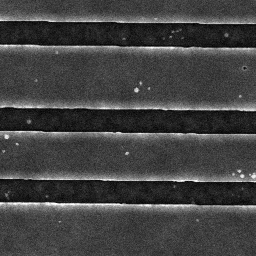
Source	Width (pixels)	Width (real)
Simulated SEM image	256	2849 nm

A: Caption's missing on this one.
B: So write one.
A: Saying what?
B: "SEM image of lines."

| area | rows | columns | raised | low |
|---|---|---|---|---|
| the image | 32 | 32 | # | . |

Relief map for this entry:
################################
################################
################################
................................
................................
................................
################################
################################
################################
################################
################################
################################
################################
...........#####################
................................
................................
######..........................
################################
################################
################################
################################
################################
............####################
................................
................................
######..........................
################################
################################
################################
################################
################################
################################